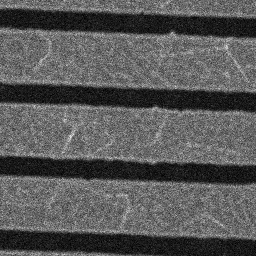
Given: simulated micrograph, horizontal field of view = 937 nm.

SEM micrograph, one or a few lines or trenches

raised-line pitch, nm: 268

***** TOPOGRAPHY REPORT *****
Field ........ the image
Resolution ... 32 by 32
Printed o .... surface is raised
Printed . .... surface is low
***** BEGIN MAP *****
oooooooooooooooooooooooooooooooo
................oooooooooooooooo
................................
................................
ooooooooooooooooooo..o..........
oooooooooooooooooooooooooooooooo
oooooooooooooooooooooooooooooooo
oooooooooooooooooooooooooooooooo
oooooooooooooooooooooooooooooooo
oooooooooooooooooooooooooooooooo
........oooooooooooooooooooooooo
................................
................................
oooooooooooooo..................
oooooooooooooooooooooooooooooooo
oooooooooooooooooooooooooooooooo
oooooooooooooooooooooooooooooooo
oooooooooooooooooooooooooooooooo
oooooooooooooooooooooooooooooooo
....o.oooooooooooooooooooooooooo
................................
................................
oooooooooo......................
oooooooooooooooooooooooooooooooo
oooooooooooooooooooooooooooooooo
oooooooooooooooooooooooooooooooo
oooooooooooooooooooooooooooooooo
oooooooooooooooooooooooooooooooo
oooooooooooooooooooooooooooooooo
........................oooooooo
................................
ooo.............................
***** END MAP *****